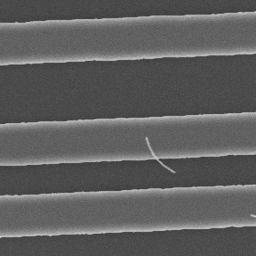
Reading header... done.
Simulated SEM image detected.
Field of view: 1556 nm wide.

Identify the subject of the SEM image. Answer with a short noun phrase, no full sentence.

lines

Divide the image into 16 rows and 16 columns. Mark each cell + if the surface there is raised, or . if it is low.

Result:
................
++++++++++++++++
++++++++++++++++
+++++++++++++...
................
................
................
.....+++++++++++
++++++++++++++++
++++++++++++++++
................
................
++++++++++++++++
++++++++++++++++
+++++++++.......
................